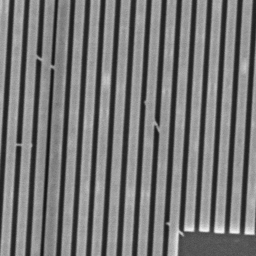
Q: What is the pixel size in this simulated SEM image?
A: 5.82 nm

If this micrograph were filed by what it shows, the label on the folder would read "parallel lines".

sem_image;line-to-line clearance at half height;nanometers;33.4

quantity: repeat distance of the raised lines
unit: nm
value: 88.4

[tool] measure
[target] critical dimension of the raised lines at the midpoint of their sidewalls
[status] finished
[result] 56 nanometres